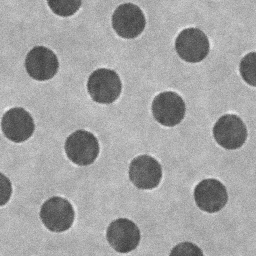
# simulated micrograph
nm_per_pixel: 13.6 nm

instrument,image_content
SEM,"a regular array of holes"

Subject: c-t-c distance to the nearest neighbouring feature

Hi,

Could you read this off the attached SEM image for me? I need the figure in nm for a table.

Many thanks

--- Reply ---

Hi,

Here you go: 902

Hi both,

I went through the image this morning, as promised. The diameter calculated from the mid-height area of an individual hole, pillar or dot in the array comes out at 36.2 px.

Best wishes